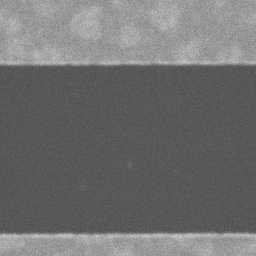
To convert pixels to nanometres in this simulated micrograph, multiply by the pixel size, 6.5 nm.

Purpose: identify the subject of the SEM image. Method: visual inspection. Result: one or a few lines or trenches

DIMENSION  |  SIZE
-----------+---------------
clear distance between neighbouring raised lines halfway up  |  1110 nm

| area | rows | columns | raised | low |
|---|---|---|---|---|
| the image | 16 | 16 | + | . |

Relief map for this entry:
++++++++++++++++
++++++++++++++++
++++++++++++++++
++++++++++++++++
................
................
................
................
................
................
................
................
................
................
................
++++++++++++++++